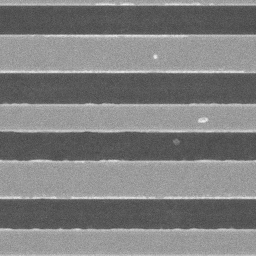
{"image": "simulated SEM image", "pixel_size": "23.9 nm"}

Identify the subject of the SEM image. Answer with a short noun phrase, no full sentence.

lines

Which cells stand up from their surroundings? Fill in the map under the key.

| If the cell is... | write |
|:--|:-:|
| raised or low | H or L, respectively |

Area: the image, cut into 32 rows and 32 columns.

HHHHHHHHHHHHHHHHHHHHHHHHHHHHHHHH
LLLLLLLLLLLLLLLLLLLLLLLLLLLLLLLL
LLLLLLLLLLLLLLLLLLLLLLLLLLLLLLLL
LLLLLLLLLLLLLLLLLLLLLLLLLLLLLLLL
HHHHHHHHHHHHHHHHHHHHHHHHHHHHHHHH
HHHHHHHHHHHHHHHHHHHHHHHHHHHHHHHH
HHHHHHHHHHHHHHHHHHHHHHHHHHHHHHHH
HHHHHHHHHHHHHHHHHHHHHHHHHHHHHHHH
HHHHHHHHHHHHHHHHHHHHHHHHHHHHHHHH
LLLLLLLLLLLLLLLLLLLLLLLLLLLLLLLL
LLLLLLLLLLLLLLLLLLLLLLLLLLLLLLLL
LLLLLLLLLLLLLLLLLLLLLLLLLLLLLLLL
LLLLLLLLLLLLLLLLLLLLLLLLLLLLLLLL
HHHHHHHHHHHHHHHHHHHHHHHHHHHHHHHH
HHHHHHHHHHHHHHHHHHHHHHHHHHHHHHHH
HHHHHHHHHHHHHHHHHHHHHHHHHHHHHHHH
LLLLLLLLLLLLLLLLLLLLLLLLLLLLLLLL
LLLLLLLLLLLLLLLLLLLLLLLLLLLLLLLL
LLLLLLLLLLLLLLLLLLLLLLLLLLLLLLLL
LLLLLLLLLLLLLLLLLLLLLLLLLLLLLLLL
HHHHHHHHHHHHHHHHHHHHHHHHHHHHHHHH
HHHHHHHHHHHHHHHHHHHHHHHHHHHHHHHH
HHHHHHHHHHHHHHHHHHHHHHHHHHHHHHHH
HHHHHHHHHHHHHHHHHHHHHHHHHHHHHHHH
HHHHHHHHHHHHHHHHHHHHHHHHHHHHHHHH
LLLLLLLLLLLLLLLLLLLLLLLLLLLLLLLL
LLLLLLLLLLLLLLLLLLLLLLLLLLLLLLLL
LLLLLLLLLLLLLLLLLLLLLLLLLLLLLLLL
LLLLLLLLLLLLLLLLLLLLLLLLLLLLLLLL
HHHHHHHHHHHHHHHHHHHHHHHHHHHHHHHH
HHHHHHHHHHHHHHHHHHHHHHHHHHHHHHHH
HHHHHHHHHHHHHHHHHHHHHHHHHHHHHHHH